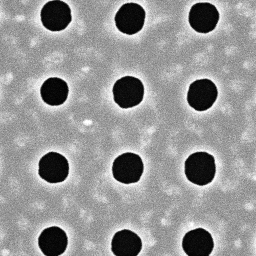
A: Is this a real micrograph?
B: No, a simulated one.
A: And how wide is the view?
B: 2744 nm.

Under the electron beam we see a regular array of holes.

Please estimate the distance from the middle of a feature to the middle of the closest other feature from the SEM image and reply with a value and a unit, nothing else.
73.3 pixels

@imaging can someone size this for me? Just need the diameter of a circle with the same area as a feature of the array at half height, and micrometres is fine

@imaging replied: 0.344